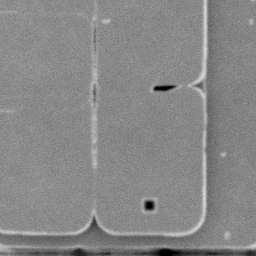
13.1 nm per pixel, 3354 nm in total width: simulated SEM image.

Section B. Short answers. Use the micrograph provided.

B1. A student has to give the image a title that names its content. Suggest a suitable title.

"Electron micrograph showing wiring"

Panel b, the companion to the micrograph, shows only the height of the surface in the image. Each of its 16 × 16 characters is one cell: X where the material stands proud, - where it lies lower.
XXXXXXXXXXXXX---
XXXXXXXXXXXXX---
XXXXXXXXXXXXX---
XXXXXXXXXXXXX---
XXXXXXXXXXXXX---
XXXXXXXXXXXX----
XXXXXXXXXXXXX---
XXXXXXXXXXXXX---
XXXXXXXXXXXXX---
XXXXXXXXXXXXX---
XXXXXXXXXXXXX---
XXXXXXXXXXXXX---
XXXXXXXXXXXXX---
XXXXXXXXXXXXX---
XXXXX--XXXXX----
----------------